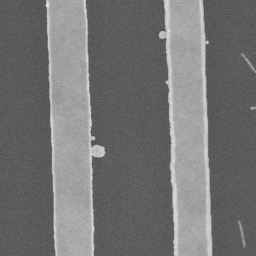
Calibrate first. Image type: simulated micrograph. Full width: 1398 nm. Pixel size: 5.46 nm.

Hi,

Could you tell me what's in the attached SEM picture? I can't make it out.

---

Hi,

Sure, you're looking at lines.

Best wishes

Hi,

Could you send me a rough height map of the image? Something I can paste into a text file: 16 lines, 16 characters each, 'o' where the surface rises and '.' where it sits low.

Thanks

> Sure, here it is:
...oo.....ooo...
...oo.....ooo...
...oo.....ooo...
...oo.....ooo...
...ooo.....oo...
...ooo.....oo...
...ooo.....oo...
...ooo.....oo...
...ooo.....oo...
...ooo.....oo...
...ooo.....oo...
...ooo.....oo...
...ooo.....oo...
...ooo.....oo...
...ooo.....oo...
...ooo.....oo...